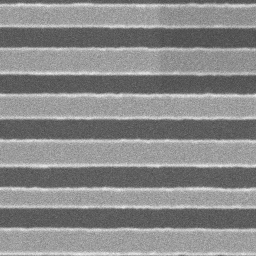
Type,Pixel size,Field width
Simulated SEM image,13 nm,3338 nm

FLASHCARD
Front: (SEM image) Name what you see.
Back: lines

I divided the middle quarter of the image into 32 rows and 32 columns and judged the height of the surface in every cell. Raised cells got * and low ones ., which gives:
********************************
********************************
................................
................................
................................
................................
................................
................................
********************************
********************************
********************************
********************************
********************************
..**.**......****..**.**...***.*
................................
................................
................................
................................
................................
********************************
********************************
********************************
********************************
********************************
********************************
***********.***************.****
................................
................................
................................
................................
................................
********************************